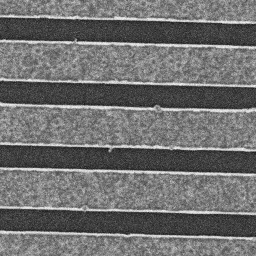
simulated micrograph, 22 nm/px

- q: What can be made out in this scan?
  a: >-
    one or a few lines or trenches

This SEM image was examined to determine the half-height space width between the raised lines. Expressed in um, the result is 0.522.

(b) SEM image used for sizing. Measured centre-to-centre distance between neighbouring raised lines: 63.8 px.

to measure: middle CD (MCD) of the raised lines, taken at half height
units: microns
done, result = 0.871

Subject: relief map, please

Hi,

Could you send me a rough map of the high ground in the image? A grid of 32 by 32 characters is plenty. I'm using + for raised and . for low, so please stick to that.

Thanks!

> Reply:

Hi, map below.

++++++++++++++++++++++++++++++++
++++++++++++++++++++++++++++++++
....................++++++++++++
................................
................................
+++++++++++++++++...............
++++++++++++++++++++++++++++++++
++++++++++++++++++++++++++++++++
++++++++++++++++++++++++++++++++
++++++++++++++++++++++++++++++++
.....................+++++++++++
................................
................................
++++++++++++++++...+............
++++++++++++++++++++++++++++++++
++++++++++++++++++++++++++++++++
++++++++++++++++++++++++++++++++
++++++++++++++++++++++++++++++++
.............+.......+++++++++++
................................
................................
+++++++++++++++++++.............
++++++++++++++++++++++++++++++++
++++++++++++++++++++++++++++++++
++++++++++++++++++++++++++++++++
++++++++++++++++++++++++++++++++
.....................+++++++++++
................................
................................
++++++++++++++++++..............
++++++++++++++++++++++++++++++++
++++++++++++++++++++++++++++++++